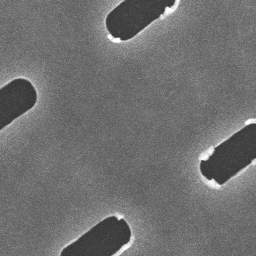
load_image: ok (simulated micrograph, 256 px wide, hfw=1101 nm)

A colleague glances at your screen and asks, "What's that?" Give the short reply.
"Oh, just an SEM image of holes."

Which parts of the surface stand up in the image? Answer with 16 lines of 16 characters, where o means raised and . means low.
ooooooo....ooooo
ooooooo..ooooooo
oooooooooooooooo
oooooooooooooooo
oooooooooooooooo
..oooooooooooooo
..oooooooooooooo
.ooooooooooooooo
oooooooooooooo..
ooooooooooooo...
ooooooooooooo..o
oooooooooooooooo
oooooooooooooooo
oooooooooooooooo
ooooo...oooooooo
oooo....oooooooo